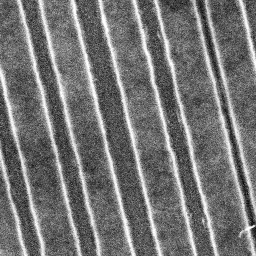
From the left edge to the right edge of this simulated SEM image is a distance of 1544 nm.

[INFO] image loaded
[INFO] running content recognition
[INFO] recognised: parallel lines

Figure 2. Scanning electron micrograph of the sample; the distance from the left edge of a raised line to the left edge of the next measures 336 nm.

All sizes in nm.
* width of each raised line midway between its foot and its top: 217